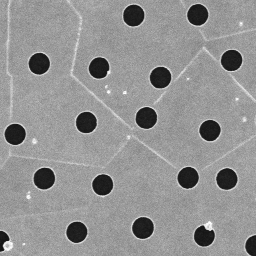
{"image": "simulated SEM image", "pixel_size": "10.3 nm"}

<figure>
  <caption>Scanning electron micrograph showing a regular array of holes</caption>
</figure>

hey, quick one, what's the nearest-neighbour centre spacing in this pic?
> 557 nm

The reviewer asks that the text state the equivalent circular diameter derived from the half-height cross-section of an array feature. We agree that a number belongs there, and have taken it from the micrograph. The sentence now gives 222 nm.